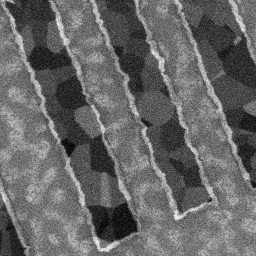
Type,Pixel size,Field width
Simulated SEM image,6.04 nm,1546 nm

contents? one or a few lines or trenches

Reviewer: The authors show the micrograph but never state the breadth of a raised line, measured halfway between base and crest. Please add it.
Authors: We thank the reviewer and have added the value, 0.258 µm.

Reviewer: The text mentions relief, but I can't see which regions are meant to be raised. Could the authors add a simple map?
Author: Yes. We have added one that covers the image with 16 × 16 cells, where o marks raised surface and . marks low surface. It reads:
ooo...ooo..oooo.
.ooo..ooo...ooo.
.ooo...oo...ooo.
.oooo..ooo..oooo
..ooo...oo...ooo
..ooo...ooo..ooo
...ooo..ooo...oo
...ooo...oo...oo
...ooo...ooo..oo
....ooo..ooo...o
....ooo...ooo..o
.....ooo..ooo...
.....ooo...oo...
o.....oo........
o.....ooo.......
oo....o.........